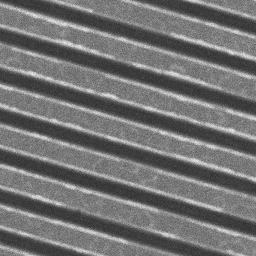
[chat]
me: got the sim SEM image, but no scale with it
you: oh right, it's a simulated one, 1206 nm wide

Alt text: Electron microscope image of parallel lines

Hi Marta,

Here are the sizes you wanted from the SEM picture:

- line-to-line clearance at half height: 67.9 nanometers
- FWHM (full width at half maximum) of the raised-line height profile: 115 nm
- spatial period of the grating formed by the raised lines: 182 nm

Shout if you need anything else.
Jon